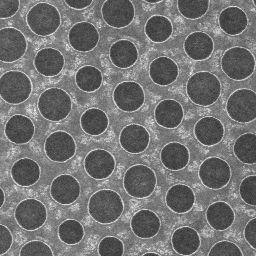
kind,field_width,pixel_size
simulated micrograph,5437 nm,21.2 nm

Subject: a regular array of holes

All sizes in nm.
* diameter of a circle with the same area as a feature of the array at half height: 620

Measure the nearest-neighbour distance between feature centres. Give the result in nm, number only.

905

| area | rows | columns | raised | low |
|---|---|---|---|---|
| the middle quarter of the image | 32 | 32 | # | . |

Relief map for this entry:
#####.#######....####.......####
####.....############........###
###......############.......####
###.......############......###.
###......######...#####....####.
###......####......############.
#####...#####.......###########.
.###########........###########.
..##########........###########.
..###########.......####....####
..###########......####......###
..####...#####....#####.......##
.####.....#############.......##
####.......############.......##
####.......############......###
####.......#####...#####....####
#####.....#####......###########
.#####...#####.......###########
..############.......###########
...###########.......###########
...###########.......####.....##
...#####..#####.....#####......#
...###......############.......#
..###.......############.......#
#####........###########.......#
#####........####....####.....##
#####.......####......#####..###
######......###........#########
...####....####........#########
....###########........#########
....###########........####....#
....######..###.......####......